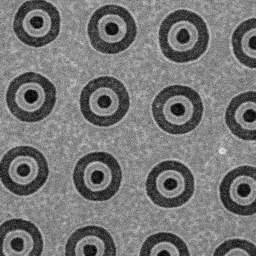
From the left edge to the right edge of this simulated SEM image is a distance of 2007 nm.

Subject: ring-shaped grooves with a dot in the middle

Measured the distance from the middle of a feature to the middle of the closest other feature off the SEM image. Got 570 nm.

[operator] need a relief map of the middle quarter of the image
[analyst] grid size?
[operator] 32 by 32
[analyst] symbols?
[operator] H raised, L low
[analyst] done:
HHHHHHHHHHHHHHHHHHHHHHHHHHHHHHHH
HHHHHHHHHHHHHHHHHHHHHHHHHHHHHHHH
HHHHHHHHHHHHHHHHHHHHHHHHHHHHHHHH
HHHHHHHHLLLLLHHHHHHHHHHHHHHHHHHH
HHHHHHLLLLLLLLHHHHHHHHHHHHHHHHHH
HHHHHLLLLLLLLLLHHHHHHHHHHHLLLLLH
HHHHLLLLHHHHLLLLHHHHHHHHLLLLLLLL
HHHHLLLHHHHHHLLLHHHHHHHLLLLLLLLL
HHHHLLLHHLLLHLLLHHHHHHHLLLLHHHLL
HHHHLLHHLLLLHHLLLHHHHHLLLLHHHHHH
HHHHLLLHHLLLHLLLHHHHHHLLLHHLLLHH
HHHHLLLHHHHHHLLLHHHHHHLLLHHLLLHH
HHHHLLLLHHHHLLLLHHHHHHLLLHHLLLHH
HHHHHLLLLLLLLLLHHHHHHHLLLHHHHHHL
HHHHHHLLLLLLLLHHHHHHHHHLLLLHHHLL
HHHHHHHHLLLLHHHHHHHHHHHHLLLLLLLL
HHHHHHHHHHHHHHHHHHHHHHHHLLLLLLLL
HHHHHHHHHHHHHHHHHHHHHHHHHHLLLLHH
HHHHHHHHHHHHHHHHHHHHHHHHHHHHHHHH
HHHHHHHHHHHHHHHHHHHHHHHHHHHHHHHH
HHHHHHHHHHHHHHHHHHHHHHHHHHHHHHHH
HHHHHHHHHHHHHHHHHHHHHHHHHHHHHHHH
HHHHHHLLLLLLHHHHHHHHHHHHHHHHHHHH
HHHHLLLLLLLLLHHHHHHHHHHHHHHHHHHH
HHHLLLLLLLLLLLHHHHHHHHHHLLLLLHHH
HHHLLLHHHHHLLLHHHHHHHHHLLLLLLLLH
HHLLLHHHLHHLLLLHHHHHHHLLLLLLLLLL
HHLLLHHLLLHHLLLHHHHHHLLLHHHHHLLL
HHLLLHHLLLHHLLLHHHHHHLLHHHLHHHLL
HHLLLHHLLLHLLLHHHHHHLLLHHLLLHHLL
HHHLLLHHHHHLLLHHHHHHLLLHHLLLHHLL
HHHLLLLHLLLLLLHHHHHHLLLLHHLHHHLL